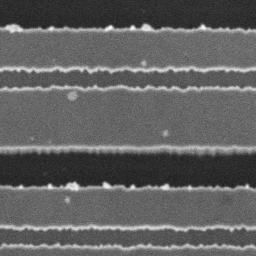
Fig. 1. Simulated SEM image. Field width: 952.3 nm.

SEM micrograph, lines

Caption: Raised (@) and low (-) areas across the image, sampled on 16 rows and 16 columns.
----------------
----------------
@@@@@@@@@@@@@@@@
@@@@@@@@@@@@@@@@
@@@@@@@@@@@@@@@@
@@@@@@@@@@@@@@@@
@@@@@@@@@@@@@@@@
@@@@@@@@@@@@@@@@
@@@@@@@@@@@@@@@@
----------------
----------------
----@-----------
@@@@@@@@@@@@@@@@
@@@@@@@@@@@@@@@@
@@@@@@@@@@@@@@@@
@@@@@@@@@@@@@@@@